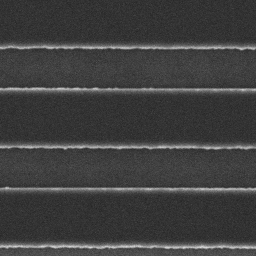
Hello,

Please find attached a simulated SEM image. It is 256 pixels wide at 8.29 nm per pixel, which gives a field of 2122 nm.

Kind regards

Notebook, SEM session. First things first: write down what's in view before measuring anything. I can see lines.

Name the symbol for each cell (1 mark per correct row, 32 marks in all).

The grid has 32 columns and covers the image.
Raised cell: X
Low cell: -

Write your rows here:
XXXXXXXXXXXXXXXXXXXXXXXXXXXXXXXX
XXXXXXXXXXXXXXXXXXXXXXXXXXXXXXXX
XXXXXXXXXXXXXXXXXXXXXXXXXXXXXXXX
XXXXXXXXXXXXXXXXXXXXXXXXXXXXXXXX
XXXXXXXXXXXXXXXXXXXXXXXXXXXXXXXX
XXXXXXXXXXXXXXXXXXXXXXXXXXXXXXXX
--------------------------------
--------------------------------
--------------------------------
--------------------------------
--------------------------------
XXXXXXXXXXXXXXXXXXXXXXXXXXXXXXXX
XXXXXXXXXXXXXXXXXXXXXXXXXXXXXXXX
XXXXXXXXXXXXXXXXXXXXXXXXXXXXXXXX
XXXXXXXXXXXXXXXXXXXXXXXXXXXXXXXX
XXXXXXXXXXXXXXXXXXXXXXXXXXXXXXXX
XXXXXXXXXXXXXXXXXXXXXXXXXXXXXXXX
XXXXXXXXXXXXXXXXXXXXXXXXXXXXXXXX
--------------X----------XXXX-X-
--------------------------------
--------------------------------
--------------------------------
--------------------------------
X-------------------------------
XXXXXXXXXXXXXXXXXXXXXXXXXXXXXXXX
XXXXXXXXXXXXXXXXXXXXXXXXXXXXXXXX
XXXXXXXXXXXXXXXXXXXXXXXXXXXXXXXX
XXXXXXXXXXXXXXXXXXXXXXXXXXXXXXXX
XXXXXXXXXXXXXXXXXXXXXXXXXXXXXXXX
XXXXXXXXXXXXXXXXXXXXXXXXXXXXXXXX
XXXXXXXXXXXXXXXXXXXXXXXXXXXXXXXX
--------------------------------